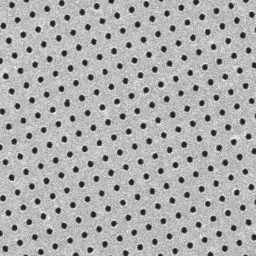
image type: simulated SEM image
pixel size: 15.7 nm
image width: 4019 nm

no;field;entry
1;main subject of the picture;a regular array of holes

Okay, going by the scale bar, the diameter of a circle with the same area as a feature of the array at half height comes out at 106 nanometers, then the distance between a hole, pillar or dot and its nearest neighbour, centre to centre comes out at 15.6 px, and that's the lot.